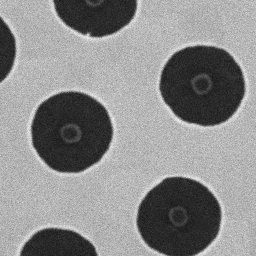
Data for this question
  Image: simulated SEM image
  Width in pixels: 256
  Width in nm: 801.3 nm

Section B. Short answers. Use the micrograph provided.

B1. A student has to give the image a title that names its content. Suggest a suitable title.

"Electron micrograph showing ring-shaped grooves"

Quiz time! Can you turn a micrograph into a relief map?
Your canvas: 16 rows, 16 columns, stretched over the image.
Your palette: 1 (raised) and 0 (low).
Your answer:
1110000001111111
1111000011111111
0111111111111111
0111111111100011
0111111111000001
1111111111001001
1110001111000001
1100000111100011
1100100111111111
1100000111111111
1110001111111111
1111111111000111
1111111110000011
1111111110010011
1100011110000011
1000001110000111